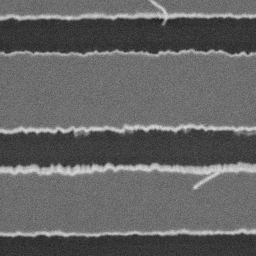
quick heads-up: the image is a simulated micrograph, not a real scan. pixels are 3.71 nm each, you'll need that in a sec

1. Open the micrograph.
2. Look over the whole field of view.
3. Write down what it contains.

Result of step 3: lines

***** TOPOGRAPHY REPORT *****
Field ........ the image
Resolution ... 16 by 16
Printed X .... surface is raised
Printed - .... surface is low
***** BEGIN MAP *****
XXXXXXXXXXXXXXXX
----------------
----------------
XXXXXXXXXXXXXXXX
XXXXXXXXXXXXXXXX
XXXXXXXXXXXXXXXX
XXXXXXXXXXXXXXXX
XXXXXXXXXXXXXXXX
----------------
----------------
-X-X-XXXXXXX-XXX
XXXXXXXXXXXXXXXX
XXXXXXXXXXXXXXXX
XXXXXXXXXXXXXXXX
XXXXXXXXXXXXXXXX
----------------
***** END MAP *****